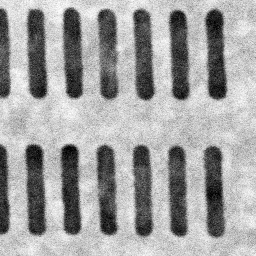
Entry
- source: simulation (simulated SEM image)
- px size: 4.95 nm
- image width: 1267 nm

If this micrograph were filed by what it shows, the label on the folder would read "a regular array of holes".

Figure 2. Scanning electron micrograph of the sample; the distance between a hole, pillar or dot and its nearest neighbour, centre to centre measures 35.4 px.